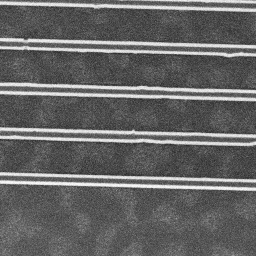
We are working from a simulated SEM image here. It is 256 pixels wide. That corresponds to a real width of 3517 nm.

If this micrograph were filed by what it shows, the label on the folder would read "parallel lines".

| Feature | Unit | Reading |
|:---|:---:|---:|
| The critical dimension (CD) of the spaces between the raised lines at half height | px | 36.2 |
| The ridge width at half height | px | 9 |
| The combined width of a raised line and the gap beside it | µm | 0.614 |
